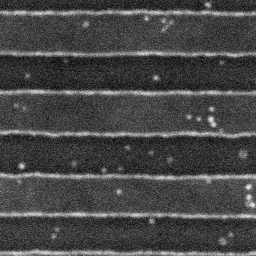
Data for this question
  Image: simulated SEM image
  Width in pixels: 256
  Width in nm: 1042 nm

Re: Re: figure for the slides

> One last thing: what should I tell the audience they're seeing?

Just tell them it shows lines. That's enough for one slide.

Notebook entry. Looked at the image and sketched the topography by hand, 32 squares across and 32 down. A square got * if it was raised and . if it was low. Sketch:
................................
.................**.............
********************************
********************************
********************************
********************************
********************************
................................
................................
................................
................................
..****..........................
********************************
********************************
********************************
********************************
********************************
................................
................................
................................
................................
................................
********************************
********************************
********************************
********************************
********************************
................................
................................
................................
................................
....*...........................